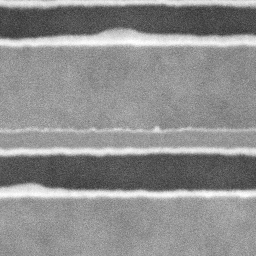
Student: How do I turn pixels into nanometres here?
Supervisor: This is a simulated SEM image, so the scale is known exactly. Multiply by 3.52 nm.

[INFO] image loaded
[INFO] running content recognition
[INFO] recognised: lines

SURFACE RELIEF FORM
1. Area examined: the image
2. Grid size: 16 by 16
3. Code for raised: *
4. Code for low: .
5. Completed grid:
................
................
......***.......
****************
****************
****************
****************
****************
****************
................
................
................
****************
****************
****************
****************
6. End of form